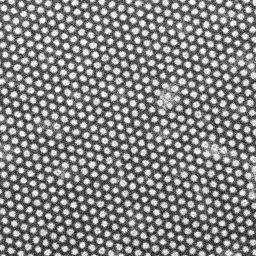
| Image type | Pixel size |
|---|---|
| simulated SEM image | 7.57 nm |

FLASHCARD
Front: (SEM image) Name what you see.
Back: a regular array of raised bodies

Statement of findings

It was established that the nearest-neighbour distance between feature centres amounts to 74.2 nanometres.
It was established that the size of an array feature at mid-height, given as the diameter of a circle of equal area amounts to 39.1 nm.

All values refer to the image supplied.